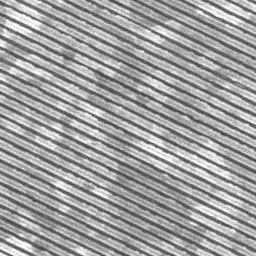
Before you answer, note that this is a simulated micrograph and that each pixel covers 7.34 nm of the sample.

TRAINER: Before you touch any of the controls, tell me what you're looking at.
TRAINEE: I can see parallel lines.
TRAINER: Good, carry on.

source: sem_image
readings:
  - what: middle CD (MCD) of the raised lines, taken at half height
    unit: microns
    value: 0.0454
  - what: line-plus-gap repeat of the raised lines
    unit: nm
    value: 74.5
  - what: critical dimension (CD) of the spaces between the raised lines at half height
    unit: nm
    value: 32.2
